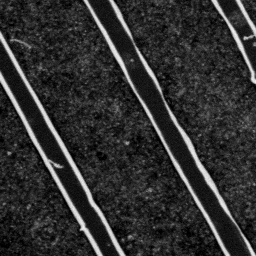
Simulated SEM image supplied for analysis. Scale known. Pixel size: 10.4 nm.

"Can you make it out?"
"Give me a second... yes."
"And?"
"one or a few lines or trenches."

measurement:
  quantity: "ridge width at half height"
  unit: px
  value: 21.3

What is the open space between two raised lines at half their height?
951 nanometers